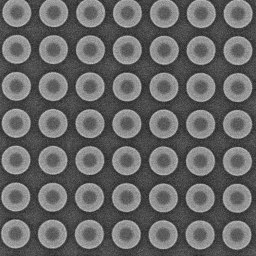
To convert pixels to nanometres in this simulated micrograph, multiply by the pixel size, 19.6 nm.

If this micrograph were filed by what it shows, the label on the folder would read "an array of small figures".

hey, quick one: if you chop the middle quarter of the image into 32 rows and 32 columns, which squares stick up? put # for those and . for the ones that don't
................................
................................
.....###......###.......##......
....#####....#####....######....
#..#######..#######...######...#
#..#######..#######...######...#
#..#######..#######...######...#
....######...######...######...#
....#####.....####.....####.....
................................
................................
......#.........................
....#####....#####....#####.....
#..#######...######...######...#
#..#######..#######..#######...#
#..#######..#######..#######...#
...#######...######...######...#
....#####....#####....#####.....
................................
................................
................................
....#####....#####.....####.....
...#######...######...######...#
#..#######..#######...######...#
#..#######..#######..#######...#
...#######..#######...######...#
....#####....#####....######...#
..............###.......##......
................................
................................
....####......####.....####.....
...######....######...######...#